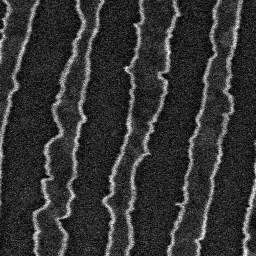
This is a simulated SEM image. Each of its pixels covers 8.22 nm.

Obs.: one or a few lines or trenches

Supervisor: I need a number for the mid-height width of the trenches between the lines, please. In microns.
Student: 0.368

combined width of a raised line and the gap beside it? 0.57 µm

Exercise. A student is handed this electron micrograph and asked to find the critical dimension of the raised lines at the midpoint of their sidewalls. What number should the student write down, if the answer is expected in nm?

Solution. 205